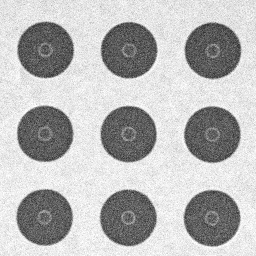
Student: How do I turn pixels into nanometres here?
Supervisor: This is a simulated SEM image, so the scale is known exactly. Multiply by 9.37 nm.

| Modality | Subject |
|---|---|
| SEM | an array of small figures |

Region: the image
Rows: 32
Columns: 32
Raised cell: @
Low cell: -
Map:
@@@@@@@@@@@@@@@@@@@@@@@@@@@@@@@@
@@@@@@@@@@@@@@@@@@@@@@@@@@@@@@@@
@@@@@@@@@@@@@@@@@@@@@@@@@@@@@@@@
@@@-----@@@@@@----@@@@@@@----@@@
@@@------@@@@------@@@@@------@@
@@-------@@@@-------@@@-------@@
@@---@---@@@@--@@---@@@---@---@@
@@-------@@@@-------@@@-------@@
@@@-----@@@@@------@@@@@-----@@@
@@@@---@@@@@@@@---@@@@@@@---@@@@
@@@@@@@@@@@@@@@@@@@@@@@@@@@@@@@@
@@@@@@@@@@@@@@@@@@@@@@@@@@@@@@@@
@@@@@@@@@@@@@@@@@@@@@@@@@@@@@@@@
@@@@---@@@@@@@@---@@@@@@@---@@@@
@@@-----@@@@@------@@@@@-----@@@
@@-------@@@@------@@@@-------@@
@@---@---@@@@--@@---@@@---@---@@
@@-------@@@@-------@@@---@---@@
@@@------@@@@------@@@@-------@@
@@@-----@@@@@@----@@@@@@-----@@@
@@@@@@@@@@@@@@@@@@@@@@@@@@@@@@@@
@@@@@@@@@@@@@@@@@@@@@@@@@@@@@@@@
@@@@@@@@@@@@@@@@@@@@@@@@@@@@@@@@
@@@@@@@@@@@@@@@@@@@@@@@@@@@@@@@@
@@@-----@@@@@@----@@@@@@-----@@@
@@-------@@@@------@@@@-------@@
@@---@---@@@@-------@@@-------@@
@@---@---@@@---@@---@@@---@---@@
@@-------@@@@------@@@@-------@@
@@@-----@@@@@------@@@@@-----@@@
@@@@---@@@@@@@@--@@@@@@@@---@@@@
@@@@@@@@@@@@@@@@@@@@@@@@@@@@@@@@